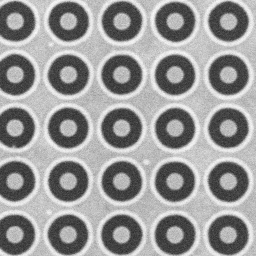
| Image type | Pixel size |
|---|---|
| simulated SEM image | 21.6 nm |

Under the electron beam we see an array of small figures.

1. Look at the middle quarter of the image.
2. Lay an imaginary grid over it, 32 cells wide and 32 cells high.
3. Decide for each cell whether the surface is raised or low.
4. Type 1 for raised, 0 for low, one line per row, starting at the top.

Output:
00000011100000000000111000000000
11100001100001110000110000111000
11100001100011110000110000111100
11100001100001110000110000111100
00000011100000000000110000000000
00000011110000000001111000000000
00000111110000000011111100000000
00001111111100000111111110000001
11111111111111111111111111101111
11111111111111111111111111111111
00011111111110001111111111100111
00001111111000000011111110000001
00000111110000000001111100000000
00000011100000000000111000000000
11000011100001110000110000011000
11100001100001110000110000111100
11100001100001110000110000111100
11000011100001110000110000011000
00000011100000000000111000000000
00000011110000000001111000000000
00001111111000000011111100000001
00111111111110001111111111000111
11111111111111111111111111111111
11111111111111111111111111111111
00001111111100000111111110000011
00000111110000000011111100000000
00000011110000000001111000000000
11000011100000100000110000010000
11100001100001110000110000111000
11100001100001110000110000111100
11100001100001110000110000111000
00000011100000000000110000000000